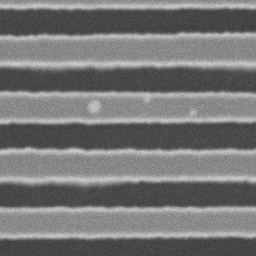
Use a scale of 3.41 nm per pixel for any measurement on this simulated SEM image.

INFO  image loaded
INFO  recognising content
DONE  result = lines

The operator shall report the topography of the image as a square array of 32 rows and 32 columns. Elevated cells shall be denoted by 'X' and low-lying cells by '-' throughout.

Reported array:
XXXXXXXXXXXXXXXXXXXXXXXXXXXXXXXX
--------------------------------
--------------------------------
--------------------------------
-----XXX---XXXXXXXXXXXXXXXXXXXXX
XXXXXXXXXXXXXXXXXXXXXXXXXXXXXXXX
XXXXXXXXXXXXXXXXXXXXXXXXXXXXXXXX
XXXXXXXXXXXXXXXXXXXXXXXXXXXXXXXX
--------------------------------
--------------------------------
--------------------------------
--------------------------------
XXXXXXXXXXXXXXXXXXXXXXXXXXXXXXXX
XXXXXXXXXXXXXXXXXXXXXXXXXXXXXXXX
XXXXXXXXXXXXXXXXXXXXXXXXXXXXXXXX
--------------------------------
--------------------------------
--------------------------------
--------------------------------
XXXXXXXXXXXXXXXXXXXXXXXXXXXXXXXX
XXXXXXXXXXXXXXXXXXXXXXXXXXXXXXXX
XXXXXXXXXXXXXXXXXXXXXXXXXXXXXXXX
XXXXXXXXXXXXXXX-XXXXX-XX-------X
--------------------------------
--------------------------------
--------------------------------
XXXXXXXXXXXXXXXXXXXXXXXXXXXXXXXX
XXXXXXXXXXXXXXXXXXXXXXXXXXXXXXXX
XXXXXXXXXXXXXXXXXXXXXXXXXXXXXXXX
XXXXXXXXXXXXXXXXXXXXXXXXXXXX--XX
--------------------------------
--------------------------------